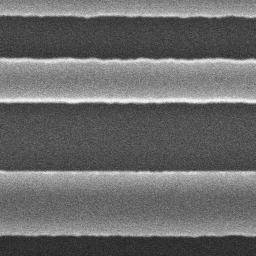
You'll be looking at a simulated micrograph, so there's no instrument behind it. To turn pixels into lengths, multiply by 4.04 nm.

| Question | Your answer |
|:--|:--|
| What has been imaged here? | lines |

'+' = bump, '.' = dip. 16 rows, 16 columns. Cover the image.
++++++++++++++++
................
................
................
++++++++++++++++
++++++++++++++++
................
................
................
................
................
++++++++++++++++
++++++++++++++++
++++++++++++++++
++++++++++++++++
................